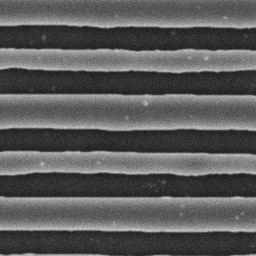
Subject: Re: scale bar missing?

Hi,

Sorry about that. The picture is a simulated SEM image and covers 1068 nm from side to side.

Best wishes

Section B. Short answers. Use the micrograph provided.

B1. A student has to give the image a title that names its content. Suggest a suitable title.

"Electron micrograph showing lines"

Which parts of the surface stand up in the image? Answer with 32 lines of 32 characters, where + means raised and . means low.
++++++++++++++++++++++++++++++++
++++++++++++++++++++++++++++++++
++++++++++++++++++++++++++++++++
.............................++.
................................
................................
++++++++++++++++++++++++++++++++
++++++++++++++++++++++++++++++++
++++++++++++++++++++++++++++++++
................................
................................
................................
++++++++++++++++++++++++++++++++
++++++++++++++++++++++++++++++++
++++++++++++++++++++++++++++++++
++++++++++++++++++++++++++++++++
................................
................................
................................
++++++++++++++++++++++++++++++++
++++++++++++++++++++++++++++++++
++++++++++++++++++++++++++++++++
................................
................................
................................
++++++++++++++++++++++++++++++++
++++++++++++++++++++++++++++++++
++++++++++++++++++++++++++++++++
++++++++++++++++++++++++++++++++
................................
................................
................................